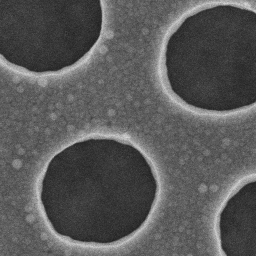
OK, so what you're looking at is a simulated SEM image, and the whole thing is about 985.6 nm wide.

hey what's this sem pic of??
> holes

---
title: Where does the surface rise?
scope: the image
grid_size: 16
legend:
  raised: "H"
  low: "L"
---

LLLLLLHHHHHHHLLH
LLLLLLHHHHHLLLLL
LLLLLLHHHHLLLLLL
LLLLLHHHHHLLLLLL
HHLHHHHHHHLLLLLL
HHHHHHHHHHLLLLLL
HHHHHHHHHHHHLLLL
HHHHHHHHHHHHHHHH
HHHHHHHHHHHHHHHH
HHHHLLLLLHHHHHHH
HHHLLLLLLLHHHHHH
HHHLLLLLLLHHHHHL
HHHLLLLLLLHHHHLL
HHHLLLLLLHHHHHLL
HHHHLLLLHHHHHHLL
HHHHHHHHHHHHHHLL